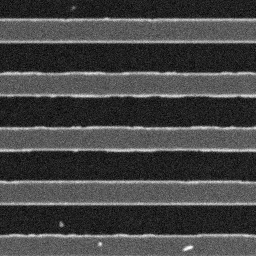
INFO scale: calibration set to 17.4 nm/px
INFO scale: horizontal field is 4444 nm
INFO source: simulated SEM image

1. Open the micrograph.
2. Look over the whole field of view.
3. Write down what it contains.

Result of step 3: lines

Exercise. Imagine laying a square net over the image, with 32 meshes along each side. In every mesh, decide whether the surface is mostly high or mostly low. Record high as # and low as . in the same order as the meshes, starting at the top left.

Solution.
................................
................................
################################
################################
################################
................................
................................
................................
................................
################################
################################
################################
................................
................................
................................
................................
################################
################################
################################
................................
................................
................................
................................
################################
################################
################################
................................
................................
................................
################################
################################
################################